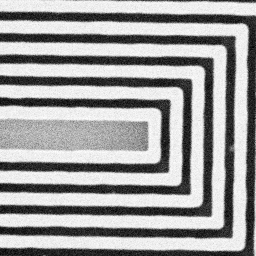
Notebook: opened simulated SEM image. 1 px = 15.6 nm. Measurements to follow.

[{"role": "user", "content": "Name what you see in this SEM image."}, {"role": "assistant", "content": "groups of lines, slits or small figures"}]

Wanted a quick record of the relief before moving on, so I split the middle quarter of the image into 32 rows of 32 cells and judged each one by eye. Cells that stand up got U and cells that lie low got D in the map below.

UUUUUUUUDDDDDDDDDDDDDDDDDDDDDDDD
UUUUUUUUUUUUUUUUUUUUUUUUUUUUUUUU
UUUUUUUUUUUUUUUUUUUUUUUUUUUUUUUU
DDDDDDDDDDDDDDDDDDDDDDDDDDDDDDUU
DDDDDDDDDDDDDDDDDDDDDDDDDDDDDDDD
DDDDDDDDDDDDDDDDDDDDDDDDDDDDDDDD
UUUUUUUUUUUUUUUUUUUUUUUUUUUUUDDD
UUUUUUUUUUUUUUUUUUUUUUUUUUUUUUDD
DDDDDDDDDUUUUUDDDDUUUUUUUUUUUUDD
DDDDDDDDDDDDDDDDDDDDDDDDDDDUUUDD
DDDDDDDDDDDDDDDDDDDDDDDDDDDUUUDD
UUUUUUUUUUUUUUUUUUUUUUUDDDDUUDDD
UUUUUUUUUUUUUUUUUUUUUUUUDDDUUDDD
UUUUUUUUUUUUUUUUUUUUUUUUDDDUUDDD
DDDDDDDDDDDDDDDDDDDDDUUUDDDUUDDD
DDDDDDDDDDDDDDDDDDDDDUUUDDDUUDDD
DDDDDDDDDDDDDDDDDDDDDUUUDDDUUDDD
DDDDDDDDDDDDDDDDDDDDDUUUDDDUUDDD
DDDDDDDDDDDDDDDDDDDDDUUUDDDUUDDD
DDDDDDDDDDDDDDDDDDDDDUUUDDDUUDDD
DDDDDDDDDDDDDDDDDDDDDUUUDDDUUDDD
DDDDDDDDDDDDDDDDDDDDDUUUDDDUUDDD
UUUUUUUUUUUUUUUUUUUUUUUUDDDUUDDD
UUUUUUUUUUUUUUUUUUUUUUUUDDDUUDDD
DDDDDDDDUUUUDDUUUUUUUUUDDDDUUDDD
DDDDDDDDDDDDDDDDDDDDDDDDDDDUUDDD
DDDDDDDDDDDDDDDDDDDDDDDDDDDUUDDD
UUUUUUUUUUUUUUUUUUUUUUDUUUUUUDDD
UUUUUUUUUUUUUUUUUUUUUUUUUUUUUDDD
UUUUUUUUUUUUUUUUUUUUUUUUUUUUUDDD
DDDDDDDDDDDDDDDDDDDDDDDDDDDDDDDD
DDDDDDDDDDDDDDDDDDDDDDDDDDDDDDDD